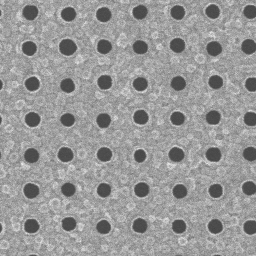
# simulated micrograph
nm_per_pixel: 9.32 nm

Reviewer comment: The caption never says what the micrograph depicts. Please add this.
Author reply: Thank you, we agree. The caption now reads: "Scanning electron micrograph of a regular array of holes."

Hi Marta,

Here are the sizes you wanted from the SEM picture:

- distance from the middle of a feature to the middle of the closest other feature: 324 nm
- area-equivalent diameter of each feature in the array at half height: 143 nanometres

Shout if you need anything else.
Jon